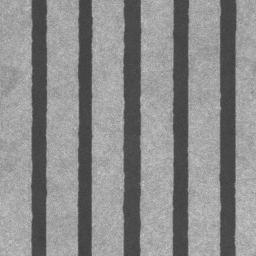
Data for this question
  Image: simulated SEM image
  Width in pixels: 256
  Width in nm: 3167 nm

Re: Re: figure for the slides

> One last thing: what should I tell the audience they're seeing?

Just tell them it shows lines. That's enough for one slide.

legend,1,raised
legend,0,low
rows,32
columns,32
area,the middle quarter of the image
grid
11100001111111100001111111100001
11100001111111100001111111100001
11100001111111100001111111100001
11100001111111100001111111100001
11110001111111100001111111100001
11110001111111100001111111100001
11110001111111100001111111100001
11100001111111100001111111100001
11110001111111100001111111100001
11110001111111100001111111100001
11110001111111100001111111100001
11110001111111100001111111100001
11110001111111100001111111100001
11110001111111100001111111100001
11110001111111100001111111100001
11110001111111100001111111100001
11110001111111100001111111100001
11100001111111100001111111100001
11110001111111100001111111100001
11110001111111100001111111100001
11110001111111100001111111100001
11100001111111100001111111100001
11100001111111100001111111100001
11100001111111100001111111100001
11110001111111100001111111100001
11110001111111100001111111100001
11100001111111100001111111100001
11100001111111100001111111100001
11100001111111100001111111100001
11110001111111100001111111100001
11100001111111100001111111100001
11110001111111100001111111100001